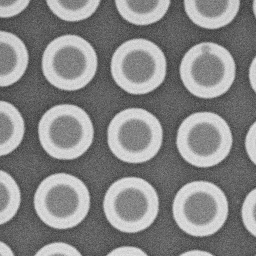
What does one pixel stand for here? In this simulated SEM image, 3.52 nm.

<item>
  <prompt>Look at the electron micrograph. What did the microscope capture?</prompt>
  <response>an array of small figures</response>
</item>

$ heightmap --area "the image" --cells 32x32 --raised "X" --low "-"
XXX---XXXXXX---XXXXXX--XXXXXXX--
XX-----XXXXX---XXXXXX--XXXXXXX--
--------XX------XXXX----XXXXX---
--------------------------X-----
XX------XX----------------------
XXX---XXXXX----XXXX------XX-----
XXX---XXXXXX--XXXXXX---XXXXXX---
XXX--XXXXXXX--XXXXXXX--XXXXXX---
XXX--XXXXXXX--XXXXXXX--XXXXXX--X
XXX---XXXXXX--XXXXXXX--XXXXXX--X
X------XXXX----XXXXX---XXXXXX--X
----------------XXX-----XXXX----
--------------------------------
XX----XXXX----------------------
XXX--XXXXXX---XXXXX-----XXX-----
XXX--XXXXXX---XXXXXX---XXXXX----
XXX--XXXXXXX--XXXXXX--XXXXXXX--X
XXX--XXXXXXX--XXXXXX--XXXXXXX--X
XX---XXXXXX---XXXXXX--XXXXXXX--X
------XXXX-----XXXX----XXXXX---X
------------------------XXX-----
--------------------------------
XX----XXXX-----XXX--------------
XX---XXXXXX---XXXXX----XXXX-----
XXX-XXXXXXX--XXXXXXX--XXXXXX---X
XX--XXXXXXX--XXXXXXX--XXXXXX--XX
XX---XXXXXX--XXXXXXX--XXXXXX--XX
X----XXXXX----XXXXX---XXXXXX--XX
-------X-------XXX-----XXXX----X
--------------------------------
X-----XX------------------------
XX---XXXXX----XXXX-----XXX------